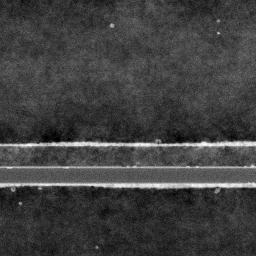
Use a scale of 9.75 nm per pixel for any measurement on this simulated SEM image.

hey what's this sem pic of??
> lines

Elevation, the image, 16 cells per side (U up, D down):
DDDDDDDDDDDDDDDD
DDDDDDDDDDDDDDDD
DDDDDDDDDDDDDDDD
DDDDDDDDDDDDDDDD
DDDDDDDDDDDDDDDD
DDDDDDDDDDDDDDDD
DDDDDDDDDDDDDDDD
DDDDDDDDDDDDDDDD
DDDDDDDDDDDDDDDD
UUUUUUUUUUUUUUUU
UUUUUUUUUUUUUUUU
UUUUUDUUUUUUUUDD
DDDDDDDDDDDDDDDD
DDDDDDDDDDDDDDDD
DDDDDDDDDDDDDDDD
DDDDDDDDDDDDDDDD